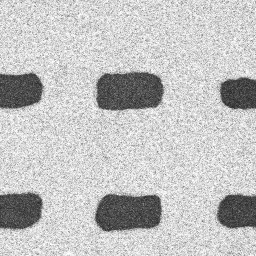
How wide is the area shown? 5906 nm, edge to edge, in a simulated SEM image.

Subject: holes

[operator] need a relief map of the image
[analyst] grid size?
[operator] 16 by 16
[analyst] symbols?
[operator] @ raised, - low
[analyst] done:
@@@@@@@@@@@@@@@@
@@@@@@@@@@@@@@@@
@@@@@@@@@@@@@@@@
@@@@@@@@@@@@@@@@
@@@@@@@@@@@@@@@@
---@@@----@@@@--
--@@@@----@@@@--
@@@@@@@@@@@@@@@@
@@@@@@@@@@@@@@@@
@@@@@@@@@@@@@@@@
@@@@@@@@@@@@@@@@
@@@@@@@@@@@@@@@@
---@@@----@@@@--
---@@@----@@@@--
@@@@@@@@@@@@@@@@
@@@@@@@@@@@@@@@@